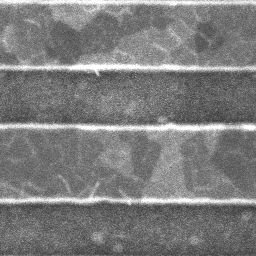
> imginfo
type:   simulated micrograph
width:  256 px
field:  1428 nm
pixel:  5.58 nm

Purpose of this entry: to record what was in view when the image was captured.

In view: one or a few lines or trenches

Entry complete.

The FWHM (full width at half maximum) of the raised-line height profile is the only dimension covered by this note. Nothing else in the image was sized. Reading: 389 nanometres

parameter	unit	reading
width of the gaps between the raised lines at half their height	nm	323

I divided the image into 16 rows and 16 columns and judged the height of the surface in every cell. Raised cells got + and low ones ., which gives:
++++++++++++++++
++++++++++++++++
++++++++++++++++
++++++++++++++++
................
................
................
................
++++++++++++++++
++++++++++++++++
++++++++++++++++
++++++++++++++++
+++.++.+++++++++
................
................
................